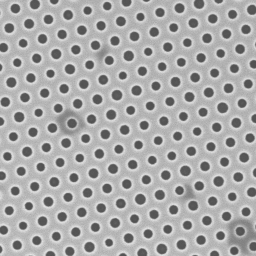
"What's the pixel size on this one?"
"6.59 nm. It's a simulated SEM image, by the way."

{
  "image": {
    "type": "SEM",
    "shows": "a regular array of holes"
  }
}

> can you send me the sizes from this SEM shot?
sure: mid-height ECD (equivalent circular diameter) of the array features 62.2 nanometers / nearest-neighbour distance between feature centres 131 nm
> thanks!